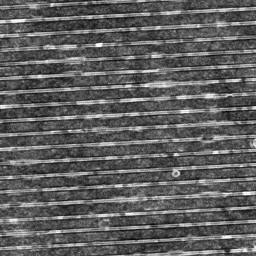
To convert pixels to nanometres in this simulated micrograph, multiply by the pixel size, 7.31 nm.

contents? parallel lines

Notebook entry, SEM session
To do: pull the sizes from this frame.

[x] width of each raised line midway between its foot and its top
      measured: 0.0155 micrometres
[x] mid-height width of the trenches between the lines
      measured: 88.5 nanometers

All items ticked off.